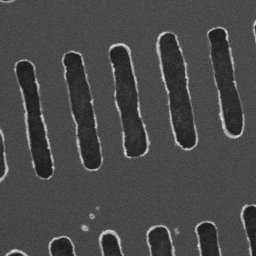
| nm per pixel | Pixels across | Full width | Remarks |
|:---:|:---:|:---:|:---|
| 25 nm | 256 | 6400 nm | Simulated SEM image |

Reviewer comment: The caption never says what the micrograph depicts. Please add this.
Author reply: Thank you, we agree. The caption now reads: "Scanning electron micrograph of holes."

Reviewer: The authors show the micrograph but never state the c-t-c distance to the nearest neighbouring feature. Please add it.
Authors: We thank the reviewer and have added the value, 1220 nanometers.